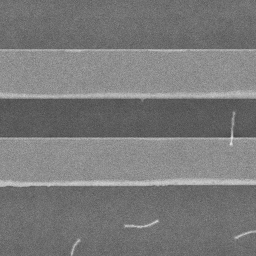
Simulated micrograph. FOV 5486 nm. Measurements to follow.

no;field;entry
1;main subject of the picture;lines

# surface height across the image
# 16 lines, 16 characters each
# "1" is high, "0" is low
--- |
0000000000000000
0000000000000000
0000000000000000
1111111111111111
1111111111111111
1111111111111111
0000000000000000
0000000000000000
0000000000000000
1111111111111111
1111111111111111
1111111111110000
0000000000000000
0000000000000000
0000000000000000
0000000000000000